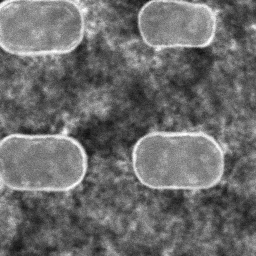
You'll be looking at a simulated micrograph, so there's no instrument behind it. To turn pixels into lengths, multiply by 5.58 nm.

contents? raised bodies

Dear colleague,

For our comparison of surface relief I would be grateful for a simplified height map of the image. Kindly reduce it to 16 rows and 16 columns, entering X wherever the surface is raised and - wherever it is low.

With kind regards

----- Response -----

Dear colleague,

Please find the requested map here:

XXXXX----XXXX---
XXXXX----XXXX---
XXXXX----XXXX---
----------------
----------------
----------------
----------------
----------------
-XXX-----XXXX---
XXXXX---XXXXXX--
XXXXX---XXXXXX--
XXXXX----XXXX---
----------------
----------------
----------------
----------------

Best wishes